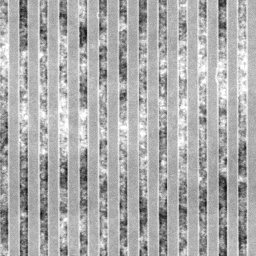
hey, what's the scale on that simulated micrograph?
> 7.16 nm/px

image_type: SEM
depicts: parallel lines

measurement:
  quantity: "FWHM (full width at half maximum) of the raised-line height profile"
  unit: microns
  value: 0.0814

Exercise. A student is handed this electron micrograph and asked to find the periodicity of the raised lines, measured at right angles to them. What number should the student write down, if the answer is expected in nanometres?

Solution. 142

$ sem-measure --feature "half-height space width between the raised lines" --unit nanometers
62.6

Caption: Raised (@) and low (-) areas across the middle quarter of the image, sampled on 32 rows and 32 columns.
-@@@--@@@--@@@--@@@--@@@--@@---@
-@@@--@@@--@@@--@@@--@@@--@@---@
-@@@--@@@--@@@--@@@--@@---@@---@
-@@@--@@@--@@@--@@@--@@---@@---@
-@@@--@@@--@@@--@@@--@@---@@---@
-@@@--@@@--@@@--@@@--@@@--@@---@
-@@@--@@@--@@@--@@@--@@@--@@---@
-@@@--@@@--@@@--@@@--@@@--@@---@
-@@@--@@@--@@@--@@@--@@---@@---@
-@@@--@@@--@@@--@@@--@@---@@---@
-@@@--@@@--@@@--@@@--@@@--@@---@
-@@@--@@@--@@@--@@@--@@@--@@---@
-@@@--@@@--@@@--@@@--@@@--@@---@
-@@@--@@@--@@@--@@@--@@@--@@---@
-@@@--@@@--@@@--@@@--@@@--@@---@
-@@@--@@@--@@@--@@@--@@@--@@---@
-@@@--@@@--@@@--@@@--@@@--@@---@
-@@@--@@@--@@@--@@@--@@@--@@---@
-@@@--@@@--@@@--@@@--@@@--@@---@
-@@@--@@@--@@@--@@@--@@@--@@---@
-@@@--@@@--@@@--@@@--@@@--@@---@
-@@@--@@@--@@@--@@@--@@@--@@---@
-@@@--@@@--@@@--@@@--@@@--@@---@
-@@@--@@@--@@@--@@@--@@@--@@---@
-@@@--@@@--@@@--@@@--@@@--@@---@
-@@@--@@@--@@@--@@@--@@@--@@---@
-@@@--@@@--@@@--@@@--@@@--@@@--@
-@@@--@@@--@@@--@@@--@@@--@@@--@
-@@@--@@@--@@@--@@@--@@---@@@--@
-@@@--@@@--@@@--@@@--@@---@@@--@
-@@@--@@@--@@@--@@@--@@---@@@--@
-@@@--@@@--@@@--@@@--@@---@@@--@